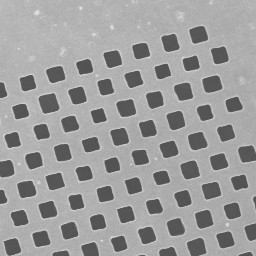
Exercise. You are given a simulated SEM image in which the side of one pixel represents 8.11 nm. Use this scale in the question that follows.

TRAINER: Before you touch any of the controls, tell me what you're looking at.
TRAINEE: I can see a regular array of holes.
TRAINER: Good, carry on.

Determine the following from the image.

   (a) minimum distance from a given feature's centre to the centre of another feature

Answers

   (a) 237 nm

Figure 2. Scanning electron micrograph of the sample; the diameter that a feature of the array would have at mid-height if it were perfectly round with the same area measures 136 nanometres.